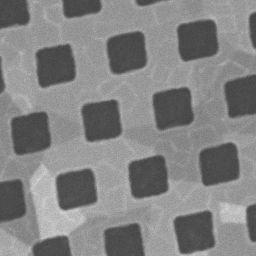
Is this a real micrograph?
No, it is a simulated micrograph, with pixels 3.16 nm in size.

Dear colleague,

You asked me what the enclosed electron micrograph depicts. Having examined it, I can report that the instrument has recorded a regular array of holes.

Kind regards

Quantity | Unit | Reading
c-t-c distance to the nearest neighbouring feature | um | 0.228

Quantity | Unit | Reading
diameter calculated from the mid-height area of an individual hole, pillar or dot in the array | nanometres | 140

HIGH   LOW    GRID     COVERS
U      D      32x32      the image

DDDDUUUUDDDDDUUUUDDUUUUUUUUUUUUU
DDDDUUUUDDDDUUUUUUUUUUUUUUUUUUUU
DDDDUUUUUUUUUUUUUUUUUUUUUDDUUUUD
DUUUUUUUUUUUUUUUUUUUUUDDDDDUUUUD
UUUUUUUUUUUUUUDDDDUUUUDDDDDUUUUD
UUUUUUUUDUUUUDDDDDUUUUDDDDDUUUUD
UUUUDDDDDUUUUDDDDDUUUUDDDDDUUUUU
UUUUDDDDDUUUUDDDDDDUUUUDUUUUUUUU
UUUUUDDDDDUUUUDDDDUUUUUUUUUUUUUU
UUUUUDDDDDUUUUUUUUUUUUUUUUUUUUUD
DUUUUDDDUUUUUUUUUUUUUUUUUUUUDDDD
UUUUUUUUUUUUUUUUUUUDDDDDUUUUDDDD
UUUUUUUUUUUUUUUUUUUDDDDDUUUUDDDD
UUUUUUUUUUDDDDDUUUUDDDDDUUUUDDDD
UUDDDDUUUUDDDDDUUUUDDDDDUUUUUDDU
UDDDDDUUUUDDDDDUUUUDDDDDUUUUUUUU
UDDDDDUUUUDDDDDUUUUUUUUUUUUUUUUU
UDDDDDUUUUUDDUUUUUUUUUUUUUUUUUUU
UUDDDDUUUUUUUUUUUUUUUUUUUUDDDDUU
UUUUUUUUUUUUUUUUUUUDUUUUUDDDDDUU
UUUUUUUUUUUUUUUUDDDDDUUUUDDDDDUU
UUUUUUUUDDDDUUUUDDDDDUUUUDDDDDUU
UDDUUUUDDDDDUUUUDDDDDUUUUDDDDDUU
DDDUUUUDDDDDUUUUDDDDDUUUUUUUUUUU
DDDUUUUDDDDDUUUUDDDUUUUUUUUUUUUU
DDDUUUUDDDDDUUUUUUUUUUUUUUUUUUUU
DDDUUUUUUUUUUUUUUUUUUUUUUDUUUUUD
DDUUUUUUUUUUUUUUUUUUUUDDDDDUUUUD
UUUUUUUUUUUUUDDDDDUUUUDDDDDUUUUD
UUUUUUUDUUUUUDDDDDUUUUDDDDDUUUUD
UUUUDDDDDUUUUDDDDDUUUUDDDDDUUUUU
UUUUDDDDDUUUUDDDDDUUUUDDDUUUUUUU